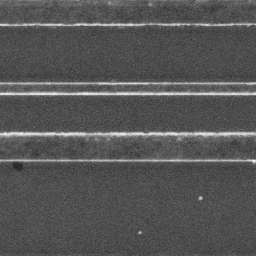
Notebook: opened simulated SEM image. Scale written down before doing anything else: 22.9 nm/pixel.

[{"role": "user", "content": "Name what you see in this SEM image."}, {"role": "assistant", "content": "lines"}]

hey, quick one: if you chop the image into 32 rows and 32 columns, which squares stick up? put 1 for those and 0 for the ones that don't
11111111111111111111111111111111
11111111111111111111111111111111
11111111111111111111111111111111
00000000000000000000000000000000
00000000000000000000000000000000
00000000000000000000000000000000
00000000000000000000000000000000
00000000000000000000000000000000
00000000000000000000000000000000
00000000000000000000000000000000
11111111111111111111111111111111
11111111111111111111111111111111
00000000000000000000000000000000
00000000000000000000000000000000
00000000000000000000000000000000
00000000000000000000000000000000
00000000000000000000000000000000
11111111111111111111111111111111
11111111111111111111111111111111
11111111111111111111111111111111
00000000000000000000000000000000
00000000000000000000000000000000
00000000000000000000000000000000
00000000000000000000000000000000
00000000000000000000000000000000
00000000000000000000000000000000
00000000000000000000000000000000
00000000000000000000000000000000
00000000000000000000000000000000
00000000000000000000000000000000
00000000000000000000000000000000
00000000000000000000000000000000